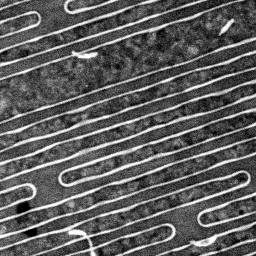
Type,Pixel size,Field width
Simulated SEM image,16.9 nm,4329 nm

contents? groups of lines, slits or small figures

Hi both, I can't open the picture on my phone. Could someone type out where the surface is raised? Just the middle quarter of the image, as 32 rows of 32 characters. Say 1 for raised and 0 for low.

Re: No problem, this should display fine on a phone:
11111111111111111111111111110000
11111111111111111111111110000000
11111111111111111111100000000111
11111111111111111100000000011111
11111111111111100000000011111111
11111111111100000000011111111111
11111111100000000001111111111110
11111100000000011111111111110000
11100000000011111111111110000000
00000000011111111111110000000001
00000011111111111110000000001111
00001111111111110000000000111111
11111111111110000000001111111111
11111111110000000001111111111110
11111100000000001111111111110000
11100000000001111111111100000000
10000000001111111111100000000000
00000001111111111110000000000111
00011111111111110000000001111111
11111111111110000000000111111111
11111111110000000001111111111111
11111100000000001111111111111000
11100000000001111111111111000000
11000000001111111111110000000000
00000001111111111110000000000111
00001111111111110000000001111111
01111111111110000000000111111111
11111111111000000000111111111111
11111110000000000111111111111100
11110000000000111111111111100000
00000000001111111111111000000000
00000001111111111111000000000111